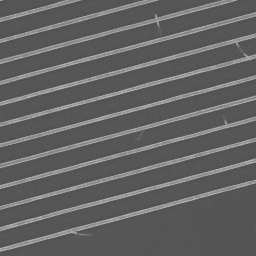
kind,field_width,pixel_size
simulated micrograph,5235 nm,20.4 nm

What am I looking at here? parallel lines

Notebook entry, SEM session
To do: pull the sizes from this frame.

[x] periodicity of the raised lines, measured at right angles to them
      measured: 413 nanometres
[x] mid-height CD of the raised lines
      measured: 69.1 nm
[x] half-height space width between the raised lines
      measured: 346 nm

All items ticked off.